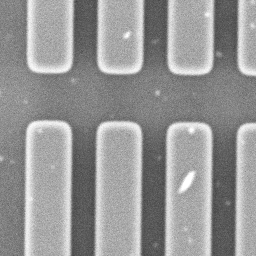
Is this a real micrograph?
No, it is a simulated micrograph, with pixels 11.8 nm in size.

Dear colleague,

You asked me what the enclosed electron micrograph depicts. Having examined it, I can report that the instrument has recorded groups of lines, slits or small figures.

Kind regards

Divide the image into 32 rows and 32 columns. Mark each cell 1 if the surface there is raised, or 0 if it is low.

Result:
00001111100011111100011111100011
00001111100011111100011111100011
00001111100011111100011111100011
00001111100011111100011111100011
00001111100011111100011111100011
00001111100011111100011111100011
00001111100011111100011111100011
00001111100011111100011111000011
00001111100001111000011111000011
00000000000000000000000000000000
00000000000000000000000000000000
00000000000000000000000000000000
00000000000000000000000000000000
00000000000000000000000000000000
00000000000000000000000000000000
00001111000001111000001110000000
00011111100011111100011111000011
00011111100011111100011111000011
00011111100011111100011111000011
00011111100011111100011111000011
00011111100011111100011111000011
00011111100011111100011111000011
00011111100011111100011111000011
00011111100011111100011111000011
00011111100011111100011111000011
00011111100011111100011111000011
00011111100011111100011111000011
00011111100011111100011111000011
00011111100011111100011111000011
00011111100011111100011111000011
00011111100011111100011111000011
00011111100011111100011111000011